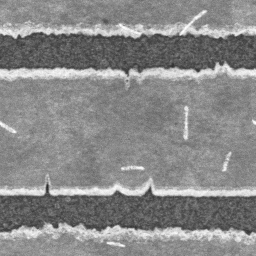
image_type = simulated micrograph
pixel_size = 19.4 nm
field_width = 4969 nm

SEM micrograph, one or a few lines or trenches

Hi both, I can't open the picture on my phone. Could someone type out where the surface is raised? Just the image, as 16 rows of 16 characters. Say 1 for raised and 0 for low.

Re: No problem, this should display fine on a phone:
1111111111111111
1111111111111111
0000000000000000
0000000000000000
0000000000000110
1111111111111111
1111111111111111
1111111111111111
1111111111111111
1111111111111111
1111111111111111
1111111111111111
0000000000000000
0000000000000000
0011110100000000
1111111111111111